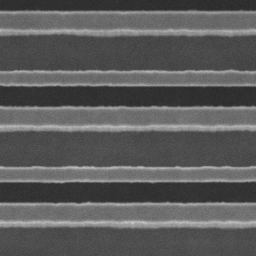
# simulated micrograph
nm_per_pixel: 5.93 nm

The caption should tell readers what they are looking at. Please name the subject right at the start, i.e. lines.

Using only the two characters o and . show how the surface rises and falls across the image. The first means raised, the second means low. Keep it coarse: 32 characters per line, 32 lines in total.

................................
oooooooooooooooooooooooooooooooo
oooooooooooooooooooooooooooooooo
oooooooooooooooooooooooooooooooo
................................
................................
................................
................................
................................
oooooooooooooooooooooooooooooooo
oooooooooooooooooooooooooooooooo
................................
................................
oooooooooooooooooooooooooooooooo
oooooooooooooooooooooooooooooooo
oooooooooooooooooooooooooooooooo
................................
................................
................................
................................
................................
oooooooooooooooooooooooooooooooo
oooooooooooooooooooooooooooooooo
................................
................................
oooooooooooooooooooooooooooooooo
oooooooooooooooooooooooooooooooo
oooooooooooooooooooooooooooooooo
................................
................................
................................
................................